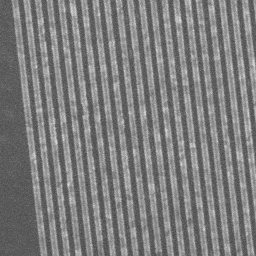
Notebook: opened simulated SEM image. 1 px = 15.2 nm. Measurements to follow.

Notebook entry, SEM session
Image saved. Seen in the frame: parallel lines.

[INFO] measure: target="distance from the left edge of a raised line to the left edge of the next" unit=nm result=174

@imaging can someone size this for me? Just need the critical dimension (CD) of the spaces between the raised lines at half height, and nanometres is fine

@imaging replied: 100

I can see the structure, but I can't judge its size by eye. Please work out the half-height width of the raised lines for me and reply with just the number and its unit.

0.0698 µm